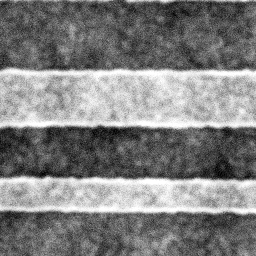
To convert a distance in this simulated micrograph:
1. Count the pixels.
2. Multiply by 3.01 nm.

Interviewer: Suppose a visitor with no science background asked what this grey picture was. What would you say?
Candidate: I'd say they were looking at lines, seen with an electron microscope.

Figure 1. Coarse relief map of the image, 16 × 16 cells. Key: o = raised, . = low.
................
................
................
................
oooooooooooooooo
oooooooooooooooo
oooooooooooooooo
oooooooooooooooo
................
................
................
oooooooooooooooo
oooooooooooooooo
................
................
................